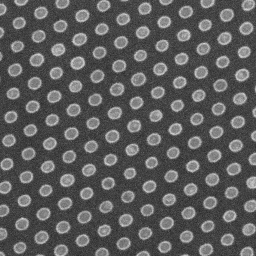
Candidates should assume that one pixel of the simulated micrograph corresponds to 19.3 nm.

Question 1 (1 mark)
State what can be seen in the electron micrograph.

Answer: a regular array of raised bodies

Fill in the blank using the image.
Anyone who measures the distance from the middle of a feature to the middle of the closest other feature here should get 0.452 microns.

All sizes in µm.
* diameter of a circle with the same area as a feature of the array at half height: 0.221